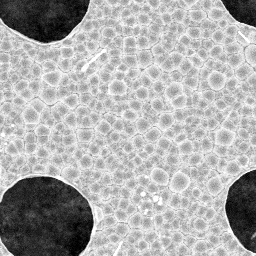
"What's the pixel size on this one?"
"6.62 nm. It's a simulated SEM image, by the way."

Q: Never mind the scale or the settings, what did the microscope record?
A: holes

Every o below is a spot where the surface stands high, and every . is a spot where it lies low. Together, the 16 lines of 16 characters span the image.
.....ooooooooo..
.....oooooooooo.
oo..oooooooooooo
oooooooooooooooo
oooooooooooooooo
oooooooooooooooo
oooooooooooooooo
oooooooooooooooo
oooooooooooooooo
oooooooooooooooo
oooooooooooooooo
o...ooooooooooo.
.....ooooooooo..
......oooooooo..
......ooooooooo.
.....oooooooooo.